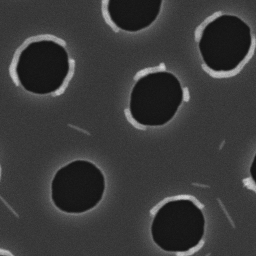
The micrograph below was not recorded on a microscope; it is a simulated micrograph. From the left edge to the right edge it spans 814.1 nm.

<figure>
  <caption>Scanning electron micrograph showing holes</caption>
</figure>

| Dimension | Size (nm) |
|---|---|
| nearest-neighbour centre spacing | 343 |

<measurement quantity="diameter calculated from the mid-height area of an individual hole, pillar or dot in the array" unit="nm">169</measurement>